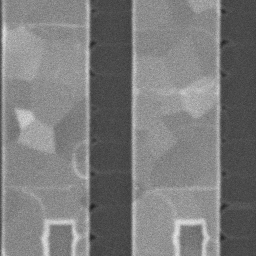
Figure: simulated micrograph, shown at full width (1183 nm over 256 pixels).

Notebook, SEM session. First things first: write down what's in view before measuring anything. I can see wiring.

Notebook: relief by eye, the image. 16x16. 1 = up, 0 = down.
1111110011111100
1111110011111100
1111110011111100
1111110011111100
1111110011111100
1111110011111100
1111110011111100
1111110011111100
1111110011111100
1111100011111100
1111110011111100
1111110011111100
1111110011111100
1111110011111100
1110010011100100
1110010011100100